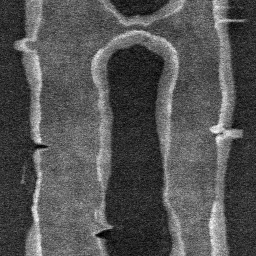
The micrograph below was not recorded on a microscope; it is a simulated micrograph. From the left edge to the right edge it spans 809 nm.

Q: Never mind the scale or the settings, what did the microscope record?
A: one or a few lines or trenches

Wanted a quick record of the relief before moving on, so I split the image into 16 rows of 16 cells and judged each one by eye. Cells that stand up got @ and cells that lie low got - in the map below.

--@@@@@----@@@--
--@@@@@@@@@@@@--
--@@@@@@-@@@@@--
--@@@@@----@@@--
--@@@@-----@@@--
--@@@@----@@@@--
--@@@@----@@@@--
--@@@@@---@@@@--
--@@@@@---@@@@--
--@@@@----@@@@--
--@@@@----@@@@--
--@@@@----@@@@--
--@@@@@---@@@@--
--@@@@-----@@@--
--@@@@-----@@@--
--@@@@-----@@@--